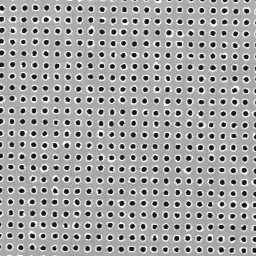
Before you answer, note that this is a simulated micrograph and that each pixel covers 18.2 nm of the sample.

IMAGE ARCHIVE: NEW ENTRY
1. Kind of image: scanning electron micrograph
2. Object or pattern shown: a regular array of holes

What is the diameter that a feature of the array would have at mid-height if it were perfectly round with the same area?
91.9 nm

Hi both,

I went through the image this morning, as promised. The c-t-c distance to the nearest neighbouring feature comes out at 10.8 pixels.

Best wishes